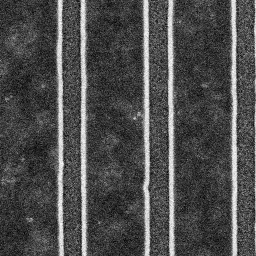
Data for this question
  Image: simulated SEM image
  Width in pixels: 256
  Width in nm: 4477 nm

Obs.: one or a few lines or trenches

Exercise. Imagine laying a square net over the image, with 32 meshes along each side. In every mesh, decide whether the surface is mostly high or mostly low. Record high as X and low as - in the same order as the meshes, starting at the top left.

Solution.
XXXXXXXX--XXXXXXXX---XXXXXXXX---
XXXXXXXX--XXXXXXXX---XXXXXXXX---
XXXXXXXX--XXXXXXXX---XXXXXXXX---
XXXXXXXX--XXXXXXXX---XXXXXXXX---
XXXXXXXX--XXXXXXXX---XXXXXXXX---
XXXXXXXX--XXXXXXXX---XXXXXXXX---
XXXXXXX---XXXXXXXX---XXXXXXXX---
XXXXXXX---XXXXXXXX---XXXXXXXX---
XXXXXXX---XXXXXXXX---XXXXXXXX---
XXXXXXXX--XXXXXXXX---XXXXXXXX---
XXXXXXXX--XXXXXXXX---XXXXXXXX---
XXXXXXXX--XXXXXXXX---XXXXXXXX---
XXXXXXXX--XXXXXXXX---XXXXXXXX---
XXXXXXXX--XXXXXXXX---XXXXXXXX---
XXXXXXXX--XXXXXXXX---XXXXXXXX---
XXXXXXXX--XXXXXXXX---XXXXXXXX---
XXXXXXXX--XXXXXXXX---XXXXXXXX---
XXXXXXXX--XXXXXXXX---XXXXXXXX---
XXXXXXXX--XXXXXXXX---XXXXXXXX---
XXXXXXXX--XXXXXXXX---XXXXXXXX---
XXXXXXXX--XXXXXXXX---XXXXXXXX---
XXXXXXXX--XXXXXXXX---XXXXXXXX---
XXXXXXX---XXXXXXXX---XXXXXXXX---
XXXXXXX---XXXXXXXX---XXXXXXXX---
XXXXXXXX--XXXXXXXX---XXXXXXXX---
XXXXXXXX---XXXXXXX---XXXXXXXX---
XXXXXXXX--XXXXXXXX---XXXXXXXX---
XXXXXXXX---XXXXXXX---XXXXXXXX---
XXXXXXXX---XXXXXXX---XXXXXXXX---
XXXXXXXX---XXXXXXX---XXXXXXXX---
XXXXXXXX---XXXXXXX---XXXXXXXX---
XXXXXXXX---XXXXXXX---XXXXXXXX---